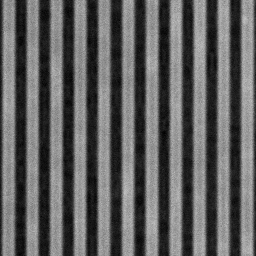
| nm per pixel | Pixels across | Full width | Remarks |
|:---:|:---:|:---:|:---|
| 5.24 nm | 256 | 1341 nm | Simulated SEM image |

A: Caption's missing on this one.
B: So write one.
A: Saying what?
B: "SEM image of parallel lines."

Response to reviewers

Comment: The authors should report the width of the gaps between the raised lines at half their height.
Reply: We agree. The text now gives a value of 58.3 nm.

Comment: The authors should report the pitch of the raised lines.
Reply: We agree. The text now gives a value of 125 nm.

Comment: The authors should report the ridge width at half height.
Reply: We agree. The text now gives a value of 67.5 nanometres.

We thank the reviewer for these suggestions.